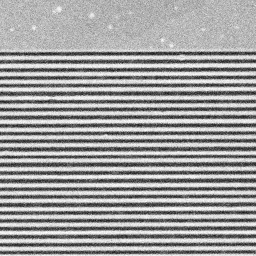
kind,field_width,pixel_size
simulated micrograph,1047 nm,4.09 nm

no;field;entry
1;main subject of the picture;parallel lines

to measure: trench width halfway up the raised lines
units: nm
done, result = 17.9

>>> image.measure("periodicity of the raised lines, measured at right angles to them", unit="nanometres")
32.5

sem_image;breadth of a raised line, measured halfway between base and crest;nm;13.8